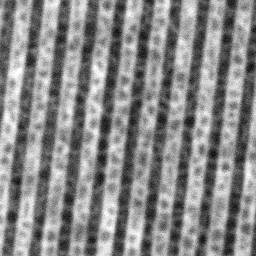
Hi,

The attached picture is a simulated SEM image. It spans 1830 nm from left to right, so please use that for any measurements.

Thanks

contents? parallel lines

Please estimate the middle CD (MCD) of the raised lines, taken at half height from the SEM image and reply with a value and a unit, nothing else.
96.7 nanometers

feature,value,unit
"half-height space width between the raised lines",102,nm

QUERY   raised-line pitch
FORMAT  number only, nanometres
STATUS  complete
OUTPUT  196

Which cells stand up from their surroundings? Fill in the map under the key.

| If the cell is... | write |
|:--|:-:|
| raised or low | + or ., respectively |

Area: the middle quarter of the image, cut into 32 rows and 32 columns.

+++....++++...+++....+++....+++.
+++....+++....+++....+++....+++.
+++....+++....+++....+++....+++.
+++....+++....+++....+++....+++.
+++....+++....+++....+++...++++.
+++....+++...++++...++++...++++.
+++....+++...++++...++++...+++..
+++...++++...+++....+++....+++..
+++...++++...+++....+++....+++..
++....+++....+++....+++....+++..
++....+++....+++....+++....+++..
++....+++....+++....+++....+++..
++....+++....+++....+++...++++..
++....+++...++++...++++...++++..
++....+++...++++...++++...+++...
++...++++...+++....+++....+++...
++...++++...+++....+++....+++...
+....+++....+++....+++....+++...
+....+++....+++....+++....+++...
+....+++....+++....+++....+++...
+....+++....+++....+++...++++...
+....+++...++++...++++...++++...
+....+++...++++...+++....+++....
+...++++...+++....+++....+++....
+...++++...+++....+++....+++....
....+++....+++....+++....+++....
....+++....+++....+++....+++....
....+++....+++....+++....+++....
....+++....+++....+++...++++...+
....+++....+++...++++...++++...+
....+++...++++...++++...+++....+
...++++...++++...++++...+++....+